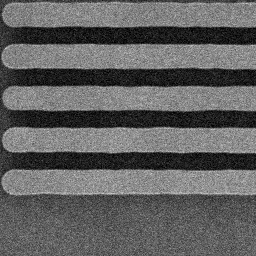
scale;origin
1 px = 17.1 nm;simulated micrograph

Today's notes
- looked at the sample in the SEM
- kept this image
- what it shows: groups of lines, slits or small figures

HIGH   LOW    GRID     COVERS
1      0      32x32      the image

01111111111111111111111111111111
11111111111111111111111111111111
01111111111111111111111111111111
00000000000000000000000000000000
00000000000000000000000000000000
00000000000000000000000000000000
11111111111111111111111111111111
11111111111111111111111111111111
01111111111111111111110011111111
00000000000000000000000000000000
00000000000000000000000000000000
01111111111111111111111111111111
11111111111111111111111111111111
01111111111111111111111111111111
00000000000000000000000000000000
00000000000000000000000000000000
01111111111111111111111111111111
11111111111111111111111111111111
01111111111111111111111111111111
00000000000000000000000000000000
00000000000000000000000000000000
01111111111111111111111111111111
11111111111111111111111111111111
01111111111111111111111111111111
00000000000000000000000000000000
00000000000000000000000000000000
00000000000000000000000000000000
00000000000000000000000000000000
00000000000000000000000000000000
00000000000000000000000000000000
00000000000000000000000000000000
00000000000000000000000000000000